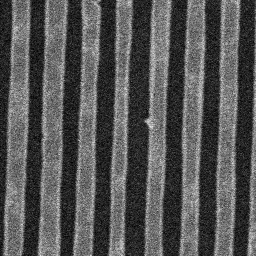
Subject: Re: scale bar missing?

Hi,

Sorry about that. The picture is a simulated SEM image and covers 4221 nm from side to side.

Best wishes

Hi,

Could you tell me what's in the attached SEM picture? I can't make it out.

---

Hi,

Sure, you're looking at parallel lines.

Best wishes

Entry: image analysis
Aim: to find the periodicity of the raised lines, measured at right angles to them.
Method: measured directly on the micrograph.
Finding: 0.576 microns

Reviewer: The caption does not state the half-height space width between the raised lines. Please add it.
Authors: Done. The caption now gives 0.313 micrometres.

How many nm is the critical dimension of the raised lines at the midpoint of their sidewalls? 255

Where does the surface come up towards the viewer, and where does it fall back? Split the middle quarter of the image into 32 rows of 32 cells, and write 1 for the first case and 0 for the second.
00000111000001110000001111000011
00000111000001110000001111000001
00000111000001110000001111000001
00000111000001110000001111000001
00000111000001100000001110000011
00000111000001100000001110000011
00000111000001100000001110000011
00001111000001100000001110000011
00001111000001100000001110000011
00001111000001110000001110000011
00001111000001110000001110000011
00001111000001100000001110000011
00001111000001100000001110000011
00001111000001100000001110000011
00001111000001100000011110000011
00001111000001100000011110000011
00001111000001100000001110000011
00001111000001110000001110000011
00001111000001100000001110000011
00001111000001100000001110000011
00001110000011100000001110000011
00001110000011100000001110000011
00001110000011100000011110000011
00001110000011100000011110000011
00001111000011100000011110000011
00001111000011100000011110000011
00001111000011100000011110000011
00011110000011100000011110000011
00011110000011100000011110000011
00011110000011100000011110000011
00011110000011100000011100000011
00011110000011100000011100000011